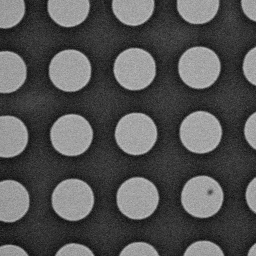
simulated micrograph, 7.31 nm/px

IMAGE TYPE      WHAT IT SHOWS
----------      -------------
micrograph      an array of small figures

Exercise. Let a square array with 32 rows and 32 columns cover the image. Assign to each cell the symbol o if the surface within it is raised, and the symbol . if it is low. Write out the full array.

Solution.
ooo...ooooo...ooooo...ooooo...oo
ooo...ooooo...ooooo...ooooo....o
ooo....ooo.....ooo.....ooo......
................................
................................
................................
o.......oo.....ooo.....oooo....o
ooo....oooo...ooooo...ooooo....o
ooo...ooooo...ooooo...ooooo...oo
ooo...ooooo...ooooo....oooo....o
ooo....oooo....oooo....ooo......
o...............................
................................
................................
........oo......oo......ooo....o
ooo....oooo....oooo....oooo....o
ooo...oooooo..oooooo...ooooo...o
ooo...ooooo....oooo....oooo....o
ooo....oooo....oooo....oooo.....
oo..............................
................................
................................
........oo......oo......ooo.....
ooo....oooo....oooo....ooooo...o
oooo...ooooo...ooooo...ooooo...o
oooo...ooooo...ooooo...ooooo...o
ooo....oooo....oooo....oooo.....
oo.......o......................
................................
................................
.........o......oo......ooo.....
ooo....oooo....ooooo...ooooo...o